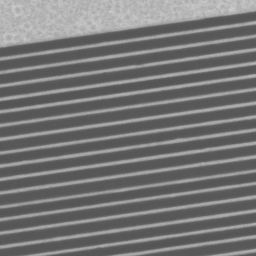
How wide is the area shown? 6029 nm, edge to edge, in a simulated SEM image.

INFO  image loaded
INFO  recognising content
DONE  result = parallel lines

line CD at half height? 93.3 nm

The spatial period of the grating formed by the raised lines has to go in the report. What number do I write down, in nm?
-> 313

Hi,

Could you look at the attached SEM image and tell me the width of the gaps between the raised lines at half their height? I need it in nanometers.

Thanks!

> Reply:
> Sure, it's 207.